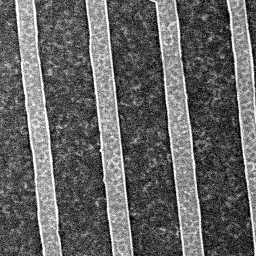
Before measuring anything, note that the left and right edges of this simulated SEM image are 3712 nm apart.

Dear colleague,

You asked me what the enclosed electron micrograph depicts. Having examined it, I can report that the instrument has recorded one or a few lines or trenches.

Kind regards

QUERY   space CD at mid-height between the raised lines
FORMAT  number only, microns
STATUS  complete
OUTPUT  0.742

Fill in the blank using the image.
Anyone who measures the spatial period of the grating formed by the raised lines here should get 1020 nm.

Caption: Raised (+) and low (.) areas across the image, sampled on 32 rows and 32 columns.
..++.......++......+++.......++.
..++.......++.......++.......++.
..++.......++.......++.......++.
..++.......+++......++.......++.
..+++......+++......++.......++.
..+++......+++......++.......++.
...++......+++......+++......++.
...++......+++......+++......++.
...++.......++.......++.......++
...++.......++.......++.......++
...++.......++.......++.......++
...++.......++.......++.......++
...+++......++.......++.......++
...+++......+++......++.......++
....++......+++......+++......++
....++......+++......+++......++
....++.......++......+++......++
....++.......++......+++......++
....++.......++......+++......++
....++.......++.......++.......+
....++.......++.......++.......+
....+++......++.......++.......+
....+++......++.......++.......+
.....++......+++......++.......+
.....++......+++......+++......+
.....++......+++......+++......+
.....++.......++......+++......+
.....++.......++.......++......+
.....++.......++.......++.......
.....++.......++.......++.......
.....++.......++.......++.......
......++......++.......++.......